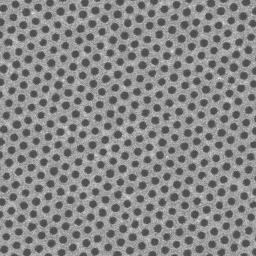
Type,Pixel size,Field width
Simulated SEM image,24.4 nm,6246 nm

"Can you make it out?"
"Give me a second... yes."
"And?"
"a regular array of holes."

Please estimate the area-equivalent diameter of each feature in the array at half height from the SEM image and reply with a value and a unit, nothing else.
202 nm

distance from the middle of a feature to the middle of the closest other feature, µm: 0.304